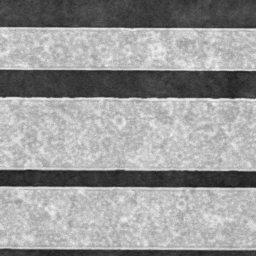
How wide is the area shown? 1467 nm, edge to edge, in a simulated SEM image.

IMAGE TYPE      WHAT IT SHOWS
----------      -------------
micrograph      one or a few lines or trenches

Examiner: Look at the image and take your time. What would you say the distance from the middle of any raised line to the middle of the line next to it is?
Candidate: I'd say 485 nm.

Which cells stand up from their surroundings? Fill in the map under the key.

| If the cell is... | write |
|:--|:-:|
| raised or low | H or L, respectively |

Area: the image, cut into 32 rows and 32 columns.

LLLLLLLLLLLLLLLLLLLLLLLLLLLLLLLL
LLLLLLLLLLLLLLLLLLLLLLLLLLLLLLLL
LLLLLLLLLLLLLLLLLLLLLLLLLLLLLLLL
LLLLLLLLLLLLLLLLLLLLLLLLLLLLLLLL
HHHHHHHHHHHHHHHHHHHHHHHHHHHHHHHH
HHHHHHHHHHHHHHHHHHHHHHHHHHHHHHHH
HHHHHHHHHHHHHHHHHHHHHHHHHHHHHHHH
HHHHHHHHHHHHHHHHHHHHHHHHHHHHHHHH
HHHHHHHHHHHHHHHHHHHHHHHHHHHHHHHH
LLLLLLLLLLLLLLLLLLLLLLLLLLLLLLLL
LLLLLLLLLLLLLLLLLLLLLLLLLLLLLLLL
LLLLLLLLLLLLLLLLLLLLLLLLLLLLLLLL
HHHHHHHHHHHHHHHHHHHLLHLHHHHHHHHH
HHHHHHHHHHHHHHHHHHHHHHHHHHHHHHHH
HHHHHHHHHHHHHHHHHHHHHHHHHHHHHHHH
HHHHHHHHHHHHHHHHHHHHHHHHHHHHHHHH
HHHHHHHHHHHHHHHHHHHHHHHHHHHHHHHH
HHHHHHHHHHHHHHHHHHHHHHHHHHHHHHHH
HHHHHHHHHHHHHHHHHHHHHHHHHHHHHHHH
HHHHHHHHHHHHHHHHHHHHHHHHHHHHHHHH
HHHHHHHHHHHHHHHHHHHHHHHHHHHHHHHH
LLLLLLLLLLLLLLLLLLLLLLLLLLLLLLLL
LLLLLLLLLLLLLLLLLLLLLLLLLLLLLLLL
HHHHHHHLLLLLLLLLLLLLLLLLLLLLLLLL
HHHHHHHHHHHHHHHHHHHHHHHHHHHHHHHH
HHHHHHHHHHHHHHHHHHHHHHHHHHHHHHHH
HHHHHHHHHHHHHHHHHHHHHHHHHHHHHHHH
HHHHHHHHHHHHHHHHHHHHHHHHHHHHHHHH
HHHHHHHHHHHHHHHHHHHHHHHHHHHHHHHH
HHHHHHHHHHHHHHHHHHHHHHHHHHHHHHHH
HHHHHHHHHHHHHHHHHHHHHHHHHHHHHHHH
LLLLLLLLLLLLLLLLLLLLLLLLLLLLLLLL